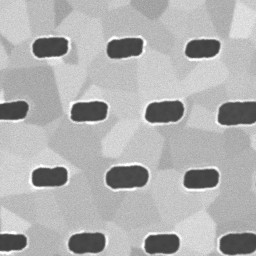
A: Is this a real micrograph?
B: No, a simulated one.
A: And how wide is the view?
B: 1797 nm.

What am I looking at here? a regular array of holes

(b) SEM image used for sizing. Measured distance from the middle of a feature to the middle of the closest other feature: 518 nm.